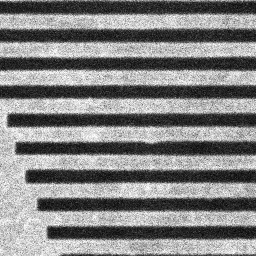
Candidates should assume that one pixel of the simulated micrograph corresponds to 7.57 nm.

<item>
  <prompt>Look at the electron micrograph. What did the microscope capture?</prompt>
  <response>parallel lines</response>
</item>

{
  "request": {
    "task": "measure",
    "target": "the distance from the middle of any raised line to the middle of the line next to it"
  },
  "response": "0.213 um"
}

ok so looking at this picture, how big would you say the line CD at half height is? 126 nanometres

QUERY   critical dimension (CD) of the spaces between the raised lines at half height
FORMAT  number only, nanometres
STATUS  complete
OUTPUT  88.9